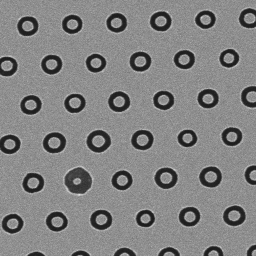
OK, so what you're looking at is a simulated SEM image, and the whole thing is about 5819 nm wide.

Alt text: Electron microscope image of a regular array of ring-shaped grooves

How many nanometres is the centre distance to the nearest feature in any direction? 1000